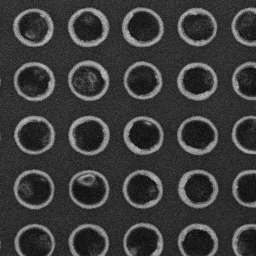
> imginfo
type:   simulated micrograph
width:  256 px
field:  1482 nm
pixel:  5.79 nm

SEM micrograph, a regular array of raised bodies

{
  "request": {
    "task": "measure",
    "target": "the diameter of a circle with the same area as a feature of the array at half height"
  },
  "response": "214 nanometers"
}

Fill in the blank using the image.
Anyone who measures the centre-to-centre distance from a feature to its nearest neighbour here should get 0.309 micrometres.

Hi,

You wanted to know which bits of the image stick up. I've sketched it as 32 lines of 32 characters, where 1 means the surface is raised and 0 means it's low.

00000000000000000000000000000000
00011000001100000110000111000011
00111100011110001111000111100111
00111100011110001111001111100111
00111100011110001111000111100011
00011000001100000110000000000000
00000000000000000000000000000000
00000000000000000000000000000000
00011100011110001110000111000011
00111100011110001111001111100111
00111110011110001111001111100111
00111100011110001111000111000011
00000000000000000000000000000000
00000000000000000000000000000000
00000000000000000000000000000000
00011100011110001111000111000011
00111110011110001111000111100111
00111110011110001111000111100111
00011100001110001111000111000011
00000000000000000000000000000000
00000000000000000000000000000000
00001000000000000100000010000001
00111100011110001111000111100011
00111110011110001111000111100111
00111100011110001111000111100111
00011100001110000110000011000001
00000000000000000000000000000000
00000000000000000000000000000000
00011000001100000110000111000011
00111100011110001111000111100111
00111110011110001111001111100111
00111110011110001111000111100111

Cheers